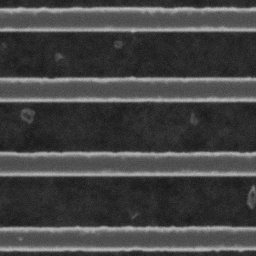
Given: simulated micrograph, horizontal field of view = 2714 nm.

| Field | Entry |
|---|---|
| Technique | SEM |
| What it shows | lines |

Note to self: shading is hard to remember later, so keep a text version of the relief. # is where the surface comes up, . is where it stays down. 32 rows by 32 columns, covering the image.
................................
################################
################################
################################
................................
................................
................................
................................
................................
................................
################################
################################
################################
................................
................................
................................
................................
................................
................................
################################
################################
################################
................................
................................
................................
................................
................................
................................
################################
################################
################################
................................